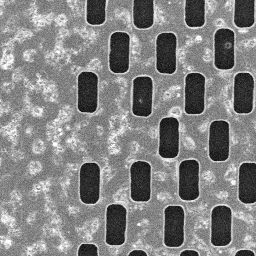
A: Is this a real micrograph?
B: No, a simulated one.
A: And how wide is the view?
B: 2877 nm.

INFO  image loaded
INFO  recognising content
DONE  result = a regular array of holes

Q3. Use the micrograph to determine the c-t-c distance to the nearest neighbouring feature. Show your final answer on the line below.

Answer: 545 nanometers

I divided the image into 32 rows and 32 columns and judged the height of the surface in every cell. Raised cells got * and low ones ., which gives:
***********..****..****...***...
***********..****..****...***...
***********..****..****...***...
******************************.*
**************..****..*****..***
**************..***...*****..***
**************..***...*****..***
**************..***...*****..***
**************..****..*****..***
**********..***********..****..*
**********..*****..****...***...
**********..*****..****...***...
**********..*****..****...***...
**********..*****..****...***...
********************************
********************..****..****
********************..****...***
********************..****...***
********************..****...***
********************..****...***
***********.*****..****..*****..
**********...***...***...*****..
**********...***...***...*****..
**********...***...***...*****..
**********..****...***...*****..
**************.*****************
*************...*****..***...***
*************...****...***...***
*************...****...***...***
*************...****...***...***
**************.******..****.****
**********..****..*****..*****..